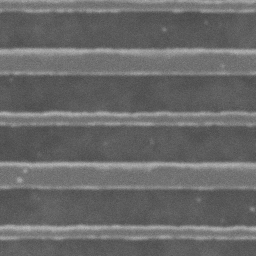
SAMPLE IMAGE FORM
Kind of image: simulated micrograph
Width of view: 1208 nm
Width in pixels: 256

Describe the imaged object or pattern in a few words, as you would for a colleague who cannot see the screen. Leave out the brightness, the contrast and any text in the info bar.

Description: lines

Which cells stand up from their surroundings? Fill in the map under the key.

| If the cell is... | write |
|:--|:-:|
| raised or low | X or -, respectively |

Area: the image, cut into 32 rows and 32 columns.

XXXXXXXXXXXXXXXXXXXXXXXXXXXXXXXX
--------------------------------
--------------------------------
--------------------------------
--------------------------------
--------------------------------
XXXXXXXXXXXXXXXXXX---XXXXXXXXX-X
XXXXXXXXXXXXXXXXXXXXXXXXXXXXXXXX
XXXXXXXXXXXXXXXXXXXXXXXXXXXXXXXX
--------------------------------
--------------------------------
--------------------------------
--------------------------------
--------------------------------
XXXXXXXXXXXXXXXXXXXXXXXXXXXXXXXX
XXXXXXXXXXXX-XX-XXXXXXXXXXXXXXXX
--------------------------------
--------------------------------
--------------------------------
--------------------------------
--------------------------------
XXXXXXXXXXXXXXXXXXXXXXXXXXXXXXXX
XXXXXXXXXXXXXXXXXXXXXXXXXXXXXXXX
------------------------X-------
--------------------------------
--------------------------------
--------------------------------
--------------------------------
XXXXXXXXXXXXXXXXXXXXXXXXXXX--XXX
XXXXXXXXXXXXXXXXXXXXXXXXXXXXXXXX
--------------------------------
--------------------------------